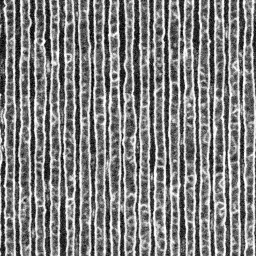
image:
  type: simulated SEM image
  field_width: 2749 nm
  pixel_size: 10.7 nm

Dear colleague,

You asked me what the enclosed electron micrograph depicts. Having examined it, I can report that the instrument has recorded parallel lines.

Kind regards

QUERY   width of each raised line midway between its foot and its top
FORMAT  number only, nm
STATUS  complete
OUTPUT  105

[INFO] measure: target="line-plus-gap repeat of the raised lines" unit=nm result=160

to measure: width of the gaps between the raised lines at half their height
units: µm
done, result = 0.0537